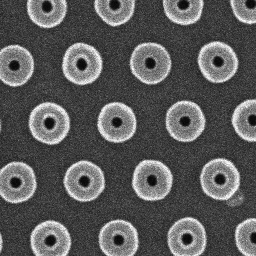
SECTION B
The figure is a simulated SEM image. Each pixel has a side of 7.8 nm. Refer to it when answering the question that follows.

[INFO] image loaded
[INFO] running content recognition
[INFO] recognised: a regular array of ring-shaped raised bodies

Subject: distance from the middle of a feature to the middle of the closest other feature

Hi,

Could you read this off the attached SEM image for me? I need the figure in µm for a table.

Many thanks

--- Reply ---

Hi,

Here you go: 0.526